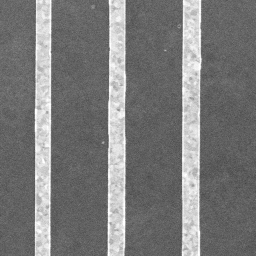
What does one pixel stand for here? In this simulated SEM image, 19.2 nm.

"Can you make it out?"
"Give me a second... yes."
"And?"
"one or a few lines or trenches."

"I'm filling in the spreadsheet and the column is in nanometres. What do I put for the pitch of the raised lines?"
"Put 1430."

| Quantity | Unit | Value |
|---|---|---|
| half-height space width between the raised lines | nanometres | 1130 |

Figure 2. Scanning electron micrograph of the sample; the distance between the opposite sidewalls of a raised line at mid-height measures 301 nm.